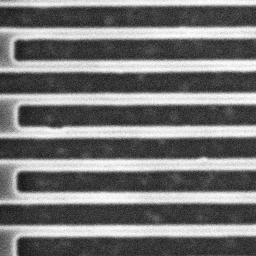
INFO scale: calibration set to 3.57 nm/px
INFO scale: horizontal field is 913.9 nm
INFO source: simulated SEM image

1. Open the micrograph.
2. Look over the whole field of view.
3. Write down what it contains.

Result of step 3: parallel lines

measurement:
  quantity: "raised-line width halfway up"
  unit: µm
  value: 0.0335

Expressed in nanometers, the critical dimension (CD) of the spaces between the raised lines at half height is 84.3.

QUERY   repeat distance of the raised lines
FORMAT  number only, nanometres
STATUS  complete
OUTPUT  118